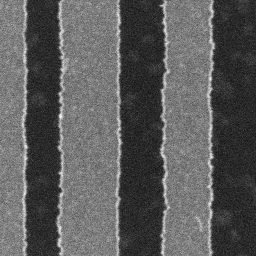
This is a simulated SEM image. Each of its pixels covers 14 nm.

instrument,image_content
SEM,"one or a few lines or trenches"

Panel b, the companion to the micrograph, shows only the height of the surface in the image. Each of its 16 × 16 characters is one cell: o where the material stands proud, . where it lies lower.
oo..ooo...ooo...
oo..ooo...ooo...
oo..ooo...ooo...
oo..ooo...ooo...
oo..ooo...ooo...
oo..ooo...ooo...
oo..ooo...ooo...
o...ooo...ooo...
oo..ooo...ooo...
oo..ooo...ooo...
oo..ooo...ooo...
oo..ooo...ooo...
oo..ooo...ooo...
oo..ooo...ooo...
oo..ooo...ooo...
oo..ooo...ooo...